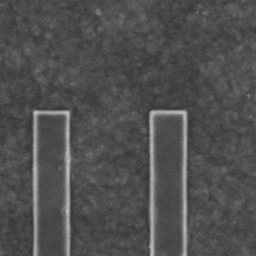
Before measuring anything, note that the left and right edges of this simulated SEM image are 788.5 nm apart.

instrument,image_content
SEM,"one or a few lines or trenches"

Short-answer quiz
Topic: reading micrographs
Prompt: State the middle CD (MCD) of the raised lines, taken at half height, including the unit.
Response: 0.104 micrometres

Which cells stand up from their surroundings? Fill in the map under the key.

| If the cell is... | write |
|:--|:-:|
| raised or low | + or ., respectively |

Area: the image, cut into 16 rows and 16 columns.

................
................
................
................
................
................
................
..++.....+++....
..++.....+++....
..++.....+++....
..++.....+++....
..++.....+++....
..++.....+++....
..++.....+++....
..++.....+++....
..++.....+++....